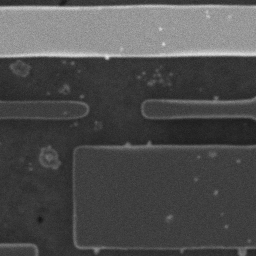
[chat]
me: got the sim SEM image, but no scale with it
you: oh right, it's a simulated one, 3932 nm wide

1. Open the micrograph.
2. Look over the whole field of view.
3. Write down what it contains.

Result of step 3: wiring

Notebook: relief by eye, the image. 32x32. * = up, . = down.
................................
********************************
********************************
********************************
********************************
********************************
********************************
................................
................................
................................
................................
................................
...................**.........**
***********.......**************
**********........**************
................................
................................
................................
..........**********************
.........***********************
.........***********************
.........***********************
.........***********************
.........***********************
.........***********************
.........***********************
.........***********************
.........***********************
.........***********************
.........***********************
.........***********************
*****...........................